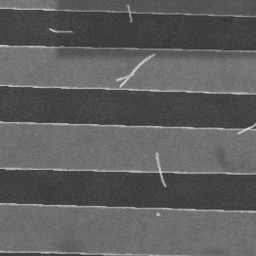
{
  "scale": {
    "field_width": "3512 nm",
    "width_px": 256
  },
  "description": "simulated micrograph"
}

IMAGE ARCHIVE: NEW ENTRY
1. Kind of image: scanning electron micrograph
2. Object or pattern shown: lines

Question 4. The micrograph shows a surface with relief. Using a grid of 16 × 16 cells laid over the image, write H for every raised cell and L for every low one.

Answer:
HHHHHHHHHHHHHHHH
LLLLLLLLLLLLLLLL
LLLLLLLLLLLLLLLL
HHHHHHHHHHHHHHHH
HHHHHHHHHHHHHHHH
LLLLHHHHHHHHHHHH
LLLLLLLLLLLLLLLL
LLLLLLLLLLLLLLLL
HHHHHHHHHHHHHHHH
HHHHHHHHHHHHHHHH
HHHHHHHHHHHHHHHH
LLLLLLLLLLLLLLLL
LLLLLLLLLLLLLLLL
HHHHHHHHHHHHHHHH
HHHHHHHHHHHHHHHH
HHHHHHHHHHHHHHHH